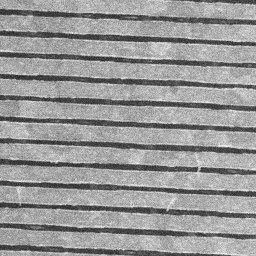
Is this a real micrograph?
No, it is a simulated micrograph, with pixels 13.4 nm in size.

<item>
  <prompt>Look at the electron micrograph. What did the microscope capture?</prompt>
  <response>parallel lines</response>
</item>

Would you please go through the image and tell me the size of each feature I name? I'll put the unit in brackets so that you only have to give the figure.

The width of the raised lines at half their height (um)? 0.201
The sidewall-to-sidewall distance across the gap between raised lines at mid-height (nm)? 82.1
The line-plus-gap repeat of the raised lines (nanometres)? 287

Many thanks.